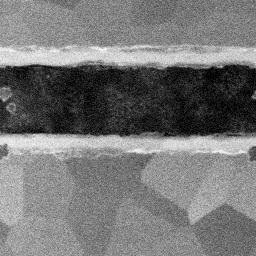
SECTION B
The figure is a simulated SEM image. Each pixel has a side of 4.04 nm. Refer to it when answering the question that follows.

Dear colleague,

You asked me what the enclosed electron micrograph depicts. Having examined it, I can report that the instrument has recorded one or a few lines or trenches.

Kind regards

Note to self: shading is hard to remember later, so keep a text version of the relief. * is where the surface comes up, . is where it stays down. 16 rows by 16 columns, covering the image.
****************
****************
****************
******.*******.*
................
................
................
................
................
****************
****************
****************
****************
****************
****************
****************